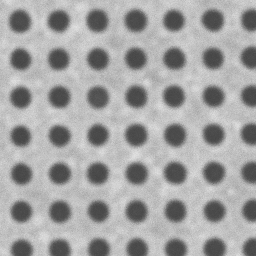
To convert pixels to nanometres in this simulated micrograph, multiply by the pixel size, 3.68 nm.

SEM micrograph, a regular array of holes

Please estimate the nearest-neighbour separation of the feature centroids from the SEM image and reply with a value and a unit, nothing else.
0.139 microns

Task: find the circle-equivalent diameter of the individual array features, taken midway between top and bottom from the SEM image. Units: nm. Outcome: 81.8